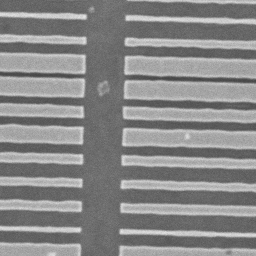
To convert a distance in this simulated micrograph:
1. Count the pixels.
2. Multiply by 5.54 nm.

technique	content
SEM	groups of lines, slits or small figures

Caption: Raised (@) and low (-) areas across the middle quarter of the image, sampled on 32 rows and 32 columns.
@@@@@----------@@@@@@@@@@@@@@@@@
@@@@@----------@@@@@@@@@@@@@@@@@
---------------@@@@@@@@@@@@@@@@@
--------------------------------
@@@@@-----------@@@@@@@@@@------
@@@@@----------@@@@@@@@@@@@@@@@@
@@@@@----------@@@@@@@@@@@@@@@@@
@@@@@----------@@@@@@@@@@@@@@@@@
---------------@@@@@@@@@@@@@@@@@
--------------------------------
@-------------------------------
@@@@@----------@@@@@@@@@@@@@@@@@
@@@@@----------@@@@@@@@@@@@@@@@@
----------------@@@@@@@@@@@@@@@@
--------------------------------
--------------------------------
@@@@@----------@@@@@@@@@----@@--
@@@@@----------@@@@@@@@@@@@@@@@@
@@@@@----------@@@@@@@@@@@@@@@@@
@@@@@----------@@@@@@@@@@@@@@@@@
-----------------------@@@@@@@@@
--------------------------------
--------------------------------
@@@@@----------@@@@@@@@@@@@@@@@@
@@@@@----------@@@@@@@@@@@@@@@@@
---------------------@@--@@@@@@@
--------------------------------
--------------------------------
--------------------------------
@@@@----------@@@@@@@@@@@@@@----
@@@@----------@@@@@@@@@@@@@@@@@@
--------------------------@@@@@@